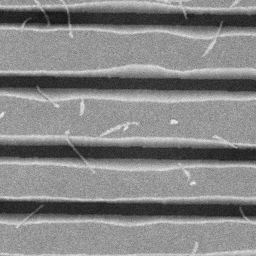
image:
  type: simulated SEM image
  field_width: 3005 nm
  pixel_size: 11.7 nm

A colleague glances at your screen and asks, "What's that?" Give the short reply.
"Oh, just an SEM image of lines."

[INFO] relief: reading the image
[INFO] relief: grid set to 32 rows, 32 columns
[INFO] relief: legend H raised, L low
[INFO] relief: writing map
HHHHHHHHHHHHHHHHHHHHHHHHHHHHHHHH
LLLLLLLLLLLLLLLLLLLLLLLHLLHHHLLH
LLLLLLLLLLLLLLLLLLLLLLLLLLLLLLLL
HHHHHHHHHHHHHHLLLLLLLLLLLLLLLLLL
HHHHHHHHHHHHHHHHHHHHHHHHHHHHHHHH
HHHHHHHHHHHHHHHHHHHHHHHHHHHHHHHH
HHHHHHHHHHHHHHHHHHHHHHHHHHHHHHHH
HHHHHHHHHHHHHHHHHHHHHHHHHHHHHHHH
HHHHHHHHHHHHHHHHHHHHHHHHHHHHHHHH
LLLLLLLLLLLLLLLLLLLLLLLLLLLLLLLL
LLLLLLLLLLLLLLLLLLLLLLLLLLLLLLLL
HHHHLLLLLLLLLLLLLLLLLLLLLLLLLLLL
HHHHHHHHHHHHHHHHHHHHHHHHHHHHHHHH
HHHHHHHHHHHHHHHHHHHHHHHHHHHHHHHH
HHHHHHHHHHHHHHHHHHHHHHHHHHHHHHHH
HHHHHHHHHHHHHHHHHHHHHHHHHHHHHHHH
HHHHHHHHHHHHHHHHHHHHHHHHHHHHHHHH
HHHHHHHHHHHHHHHHHHHHHHHHHHHHHHHH
LLLLLLLLLLLLLLLLLLLLLLLLLLLLLLLL
LLLLLLLLLLLLLLLLLLLLLLLLLLLLLLLL
HHHHHHHHHHHHHHHLLLLLLHHHHHHHHHHH
HHHHHHHHHHHHHHHHHHHHHHHHHHHHHHHH
HHHHHHHHHHHHHHHHHHHHHHHHHHHHHHHH
HHHHHHHHHHHHHHHHHHHHHHHHHHHHHHHH
HHHHHHHHHHHHHHHHHHHHHHHHHHHHHHHH
LLLLLLLLLLLLLLLLLLLLLLLLLLLLLLLL
LLLLLLLLLLLLLLLLLLLLLLLLLLLLLLLL
HHHHHHHHHHHHHHHHHHHHHHHHHHHHHHHH
HHHHHHHHHHHHHHHHHHHHHHHHHHHHHHHH
HHHHHHHHHHHHHHHHHHHHHHHHHHHHHHHH
HHHHHHHHHHHHHHHHHHHHHHHHHHHHHHHH
HHHHHHHHHHHHHHHHHHHHHHHHHHHHHHHH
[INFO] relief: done